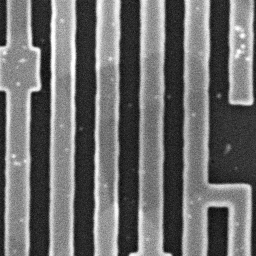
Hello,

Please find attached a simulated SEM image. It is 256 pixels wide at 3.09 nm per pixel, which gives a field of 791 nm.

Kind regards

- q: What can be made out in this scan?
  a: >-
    wiring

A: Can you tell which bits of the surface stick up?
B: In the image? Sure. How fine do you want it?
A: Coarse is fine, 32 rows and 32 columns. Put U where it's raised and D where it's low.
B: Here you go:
DUUUDDDUUDDDUUUDDDUUUDDUUUDDDUUU
DUUUDDDUUDDDUUUDDDUUUDDUUUDDDUUU
DUUUDDUUUDDDUUUDDDUUUDDUUUDDDUUU
DUUUDDUUUDDDUUUDDDUUUDDUUUDDDUUD
DUUUDDUUUDDDUUUDDDUUUDDUUUDDDUUU
DUUUDDUUUDDDUUUDDDUUUDDUUUDDDUUU
UUUUUDDUUDDDUUUDDDUUDDDUUUDDDUUD
UUUUUDUUUDDDUUUDDDUUDDDUUUDDDUUD
UUUUUDUUUDDDUUUDDDUUDDDUUUDDDUUD
UUUUUDDUUDDDUUUDDDUUDDDUUUDDDUUD
UUUUUDUUUDDDUUUDDDUUUDDUUUDDDUUD
DUUUDDUUUDDDUUUDDUUUUDDUUUDDDUUD
DUUUDDUUUDDDUUUDDUUUDDDUUUDDDUUU
DUUUDDUUUDDDUUUDDUUUDDDUUUDDDDDD
DUUUDDUUUDDDUUUDDDUUDDDUUUDDDDDD
DUUUDDUUUDDDUUUDDUUUDDDUUUDDDDDD
DUUUDDUUUDDDUUUDDUUUDDDUUUDDDDDD
DUUUDDUUUDDDUUUDDUUUDDDUUUDDDDDD
DUUUDDUUUDDDUUUDDUUUDDDUUUDDDDDD
DUUUDDUUUDDDUUUDDUUUDDDUUUDDDDDD
DUUUDDUUUDDDUUUDDUUUDDDUUUDDDDDD
DUUUDDUUUDDDUUUDDUUUDDDUUUDDDDDD
DUUUDDUUUDDDUUUDDUUUDDDUUUDDDDDD
DUUUDDUUUDDDUUUDDUUUDDDUUUUUUUUD
DUUUDDUUUDDDUUUDDUUUDDDUUUUUUUUD
DUUUDDUUUDDDUUUDDUUUDDDUUUUUUUUD
DUUUDDUUUDDDUUUDDUUUDDDUUUDDDUUD
DUUUDDUUUDDDUUUDDUUUDDDUUUDDDUUD
DUUUDDUUUDDDUUUDDUUUDDDUUUDDDUUD
DUUUDDUUUDDDUUUDDUUUDDDUUUDDDUUD
DUUUDDUUUDDDUUUDDUUUDDDUUUDDDUUD
DUUUDDUUUDDDUUUDDUUUUDDUUUDDDUUD